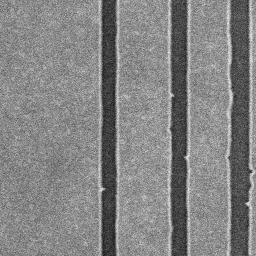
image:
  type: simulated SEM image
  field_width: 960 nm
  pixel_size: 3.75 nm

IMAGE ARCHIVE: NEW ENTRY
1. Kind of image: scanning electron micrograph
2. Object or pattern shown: one or a few lines or trenches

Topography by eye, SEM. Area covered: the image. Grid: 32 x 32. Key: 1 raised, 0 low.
11111111111110011111100011111001
11111111111110011111100011111001
11111111111110011111100011111001
11111111111110011111100111111001
11111111111110011111100111111001
11111111111110011111100111111001
11111111111110011111100011111001
11111111111110011111100011111001
11111111111110011111100111111001
11111111111110011111100111111001
11111111111110011111100111111001
11111111111110011111100011111001
11111111111110011111100011111001
11111111111110011111100011111001
11111111111110011111100011111001
11111111111110011111100011111001
11111111111110011111100011111001
11111111111110011111100011111001
11111111111110011111100011111001
11111111111110011111100111111001
11111111111110011111100011111001
11111111111110011111100011111001
11111111111110011111100011111001
11111111111110011111100011111001
11111111111110011111100111111001
11111111111110011111100011111001
11111111111110011111100011111001
11111111111110011111100011111001
11111111111110011111100011111001
11111111111110011111100011111001
11111111111110011111100011111001
11111111111110011111100011111001